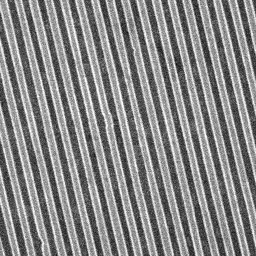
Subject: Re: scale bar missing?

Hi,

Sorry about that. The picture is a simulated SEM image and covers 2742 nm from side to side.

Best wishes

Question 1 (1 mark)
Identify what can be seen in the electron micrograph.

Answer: parallel lines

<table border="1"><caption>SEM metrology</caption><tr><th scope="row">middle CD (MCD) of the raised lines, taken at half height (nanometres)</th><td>73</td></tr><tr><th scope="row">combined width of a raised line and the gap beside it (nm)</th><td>160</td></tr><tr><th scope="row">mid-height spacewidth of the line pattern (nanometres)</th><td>80.8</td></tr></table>